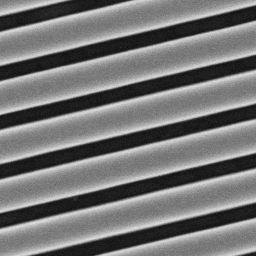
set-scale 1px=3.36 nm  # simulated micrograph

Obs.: parallel lines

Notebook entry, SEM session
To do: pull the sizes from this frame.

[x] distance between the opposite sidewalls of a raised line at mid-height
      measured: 110 nanometres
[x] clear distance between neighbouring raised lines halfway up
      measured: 15.1 px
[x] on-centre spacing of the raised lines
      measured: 161 nm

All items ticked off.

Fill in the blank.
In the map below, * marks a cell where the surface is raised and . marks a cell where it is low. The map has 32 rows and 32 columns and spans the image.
******.........*****************
**........*******************...
......******************........
..******************........****
****************........********
************........************
*******.........****************
***........******************...
.......******************.......
...******************........***
****************.........*******
************........************
********........****************
****........******************..
........******************......
....*****************.........**
*****************........*******
*************........***********
********.........***************
****.........*****************..
........******************......
....******************........**
******************........******
*************.........**********
*********........***************
*****........******************.
*........******************.....
.....*****************.........*
.*****************.........*****
**************........**********
**********........**************
******........******************